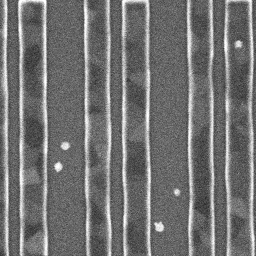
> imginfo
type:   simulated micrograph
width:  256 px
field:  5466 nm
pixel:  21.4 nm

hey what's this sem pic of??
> wiring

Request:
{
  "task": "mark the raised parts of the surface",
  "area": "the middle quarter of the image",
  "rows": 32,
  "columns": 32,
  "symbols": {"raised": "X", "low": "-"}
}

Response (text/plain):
-----XXXXXX----XXXXXX----------X
-----XXXXXX----XXXXXX-----------
-----XXXXXX----XXXXXX-----------
-----XXXXXX----XXXXXX-----------
-----XXXXXX----XXXXXX-----------
-----XXXXXX----XXXXXX-----------
-----XXXXXX----XXXXXX-----------
-----XXXXXX----XXXXXX-----------
-----XXXXXX----XXXXXX-----------
-----XXXXXX----XXXXXX-----------
-----XXXXXX----XXXXXX-----------
-----XXXXXX----XXXXXX-----------
-----XXXXXX----XXXXXX-----------
-----XXXXXX----XXXXXX-----------
-----XXXXXX----XXXXXX-----------
------XXXXX----XXXXXX----------X
------XXXXX----XXXXXX----------X
------XXXXXX---XXXXXX----------X
-----XXXXXXX---XXXXXX----------X
-----XXXXXX----XXXXXX----------X
X----XXXXXX----XXXXXX----------X
-----XXXXXX----XXXXXX----------X
------XXXXX----XXXXXX----------X
------XXXXX----XXXXXX----------X
------XXXXX----XXXXXX----------X
------XXXXX----XXXXXX-----------
------XXXXX----XXXXXX-----------
------XXXXX----XXXXXX-----------
------XXXXX----XXXXXX-----------
------XXXXX----XXXXXX-----------
------XXXXX----XXXXXX-----------
------XXXXX----XXXXXX-----------